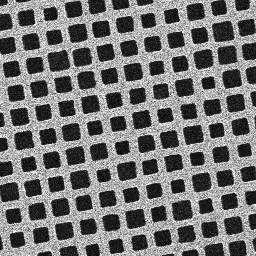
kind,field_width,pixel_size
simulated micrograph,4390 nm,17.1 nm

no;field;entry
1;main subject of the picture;a regular array of holes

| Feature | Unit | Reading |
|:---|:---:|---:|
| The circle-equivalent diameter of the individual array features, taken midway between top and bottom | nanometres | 306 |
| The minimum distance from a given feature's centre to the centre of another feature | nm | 407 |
